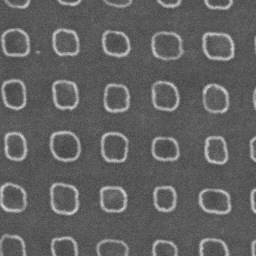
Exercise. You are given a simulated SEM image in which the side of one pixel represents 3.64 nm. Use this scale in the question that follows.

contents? a regular array of raised bodies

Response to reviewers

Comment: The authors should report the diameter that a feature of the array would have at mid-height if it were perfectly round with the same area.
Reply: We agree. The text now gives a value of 27.1 px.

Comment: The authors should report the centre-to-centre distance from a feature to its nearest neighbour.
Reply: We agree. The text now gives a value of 182 nm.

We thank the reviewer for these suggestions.